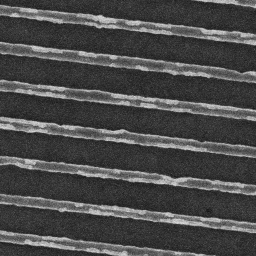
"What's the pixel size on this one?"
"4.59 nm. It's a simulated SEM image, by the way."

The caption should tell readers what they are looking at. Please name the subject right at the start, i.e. parallel lines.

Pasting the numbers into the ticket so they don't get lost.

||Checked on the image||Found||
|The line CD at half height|9.67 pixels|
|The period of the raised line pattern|37.4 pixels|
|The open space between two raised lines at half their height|27.3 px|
